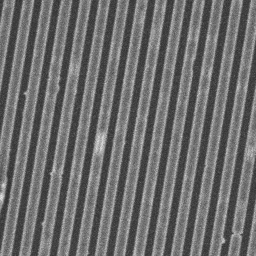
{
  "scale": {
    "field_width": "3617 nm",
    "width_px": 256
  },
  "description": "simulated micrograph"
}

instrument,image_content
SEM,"parallel lines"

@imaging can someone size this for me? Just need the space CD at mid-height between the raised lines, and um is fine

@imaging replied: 0.124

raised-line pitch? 264 nanometres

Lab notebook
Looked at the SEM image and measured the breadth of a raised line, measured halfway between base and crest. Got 9.62 px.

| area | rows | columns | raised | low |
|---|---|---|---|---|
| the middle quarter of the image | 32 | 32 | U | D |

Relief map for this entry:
DDUUDDUUUDDUUDDDUUDDUUUDDUUUDDUU
DUUUDDUUUDDUUDDDUUDDUUUDDUUDDDUU
DUUDDDUUDDDUUDDUUUDDUUUDDUUDDDUU
DUUDDDUUDDDUUDDUUDDDUUDDDUUDDUUU
DUUDDUUUDDUUUDDUUDDDUUDDDUUDDUUU
DUUDDUUUDDUUUDDUUDDDUUDDUUUDDUUU
DUUDDUUUDDUUDDDUUDDUUUDDUUUDDUUD
UUUDDUUUDDUUDDDUUDDUUUDDUUDDDUUD
UUUDDUUDDDUUDDUUUDDUUUDDUUDDDUUD
UUDDDUUDDDUUDDUUUDDUUDDDUUDDUUUD
UUDDDUUDDUUUDDUUDDDUUDDDUUDDUUUD
UUDDUUUDDUUUDDUUDDDUUDDUUUDDUUUD
UUDDUUUDDUUDDDUUDDUUUDDUUUDDUUDD
UUDDUUUDDUUDDDUUDDUUUDDUUDDDUUDD
UUDDUUDDDUUDDUUUDDUUUDDUUDDDUUDD
UDDDUUDDDUUDDUUUDDUUDDDUUDDUUUDD
UDDDUUDDUUUDDUUDDDUUDDDUUDDUUUDD
UDDUUUDDUUUDDUUDDDUUDDUUUDDUUUDD
UDDUUUDDUUDDDUUDDUUUDDUUUDDUUDDD
UDDUUUDDUUDDUUUDDUUUDDUUDDDUUDDD
UDDUUDDDUUDDUUUDDUUUDDUUDDDUUDDU
DDDUUDDDUUDDUUUDDUUDDDUUDDUUUDDU
DDDUUDDUUUDDUUDDDUUDDDUUDDUUUDDU
DDUUUDDUUUDDUUDDDUUDDUUUDDUUUDDU
DDUUUDDUUDDDUUDDUUUDDUUUDDUUDDDU
DDUUUDDUUDDDUUDDUUUDDUUDDDUUDDDU
DDUUDDDUUDDUUUDDUUUDDUUDDDUUDDUU
DDUUDDDUUDDUUUDDUUDDDUUDDUUUDDUU
DDUUDDUUUDDUUDDDUUDDDUUDDUUUDDUU
DUUUDDUUUDDUUDDDUUDDUUUDDUUUDDUU
DUUUDDUUDDDUUDDUUUDDUUUDDUUDDDUU
DUUUDDUUDDDUUDDUUUDDUUDDDUUDDDUU